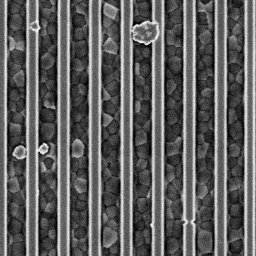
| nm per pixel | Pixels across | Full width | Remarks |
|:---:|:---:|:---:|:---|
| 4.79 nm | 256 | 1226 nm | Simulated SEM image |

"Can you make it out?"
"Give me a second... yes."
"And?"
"parallel lines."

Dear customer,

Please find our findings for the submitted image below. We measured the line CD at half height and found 45.5 nanometers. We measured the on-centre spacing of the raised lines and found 31.1 px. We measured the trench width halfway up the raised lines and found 104 nm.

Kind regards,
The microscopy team